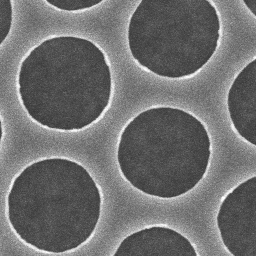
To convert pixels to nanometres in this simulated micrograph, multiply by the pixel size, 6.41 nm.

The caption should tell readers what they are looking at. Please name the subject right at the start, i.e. holes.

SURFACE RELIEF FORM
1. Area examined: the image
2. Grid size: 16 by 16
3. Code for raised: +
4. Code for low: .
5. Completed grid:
.+++.++++....+++
.+++++++......++
+++..+++......++
++....++.....+++
+......+++..+++.
+......+++++++..
++.....+++++++..
++....++....++..
++++++++.....++.
+++++++......+++
++...+++.....+++
+.....++....+++.
+.....++++++++..
+.....++++++++..
+.....+++..+++..
++...++.....++..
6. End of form